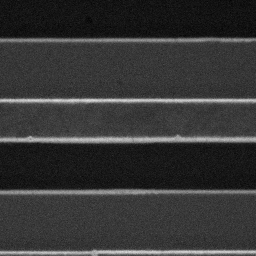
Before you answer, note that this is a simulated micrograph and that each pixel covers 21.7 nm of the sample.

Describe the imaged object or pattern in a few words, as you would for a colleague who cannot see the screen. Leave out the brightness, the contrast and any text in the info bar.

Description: lines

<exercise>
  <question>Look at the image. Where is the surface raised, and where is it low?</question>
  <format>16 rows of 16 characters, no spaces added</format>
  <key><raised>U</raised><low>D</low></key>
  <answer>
DDDDDDDDDDDDDDDD
DDDDDDDDDDDDDDDD
DDDDDDDDDDDDDDDD
UUUUUUUUUUUUUUUU
UUUUUUUUUUUUUUUU
UUUUUUUUUUUUUUUU
UUUUUUUUUUUUUUUU
UUUUUUUUUUUUUUUU
UUUUUUUUUUUUUUUU
DDDDDDDDDDDDDDDD
DDDDDDDDDDDDDDDD
DDDDDDDDDDDDDDDD
UUUUUUUUUUUUUUUU
UUUUUUUUUUUUUUUU
UUUUUUUUUUUUUUUU
UUUUUUUUUUUUUUUU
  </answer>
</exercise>